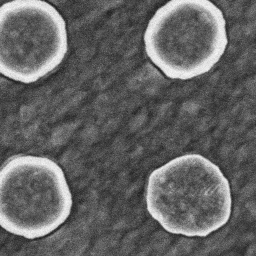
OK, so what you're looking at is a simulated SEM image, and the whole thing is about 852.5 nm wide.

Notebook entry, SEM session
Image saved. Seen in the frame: raised bodies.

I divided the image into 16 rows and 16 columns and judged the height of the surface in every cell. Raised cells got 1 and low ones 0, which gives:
1110000000111000
1111000001111100
1111000001111100
1111000000111100
1110000000010000
0000000000000000
0000000000000000
0000000000000000
0000000000000000
0000000000000000
1110000000000000
1111000000000000
1111000000000000
1111000000000000
0110000000000000
0000000000000000